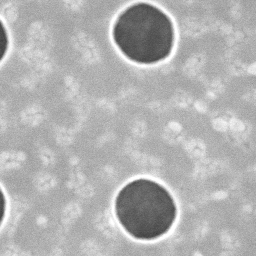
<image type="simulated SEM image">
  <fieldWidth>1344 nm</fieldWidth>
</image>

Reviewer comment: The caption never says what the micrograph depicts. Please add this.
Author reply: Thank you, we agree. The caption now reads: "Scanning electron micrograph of holes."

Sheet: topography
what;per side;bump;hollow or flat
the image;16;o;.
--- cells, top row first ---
oooooooo..oooooo
ooooooo....ooooo
ooooooo....ooooo
oooooooo..oooooo
oooooooooooooooo
oooooooooooooooo
oooooooooooooooo
oooooooooooooooo
oooooooooooooooo
oooooooooooooooo
oooooooooooooooo
oooooooo..oooooo
ooooooo....ooooo
ooooooo....ooooo
oooooooo..oooooo
oooooooooooooooo